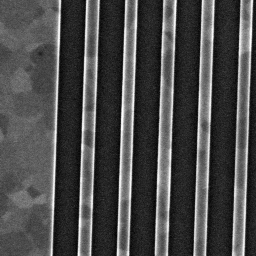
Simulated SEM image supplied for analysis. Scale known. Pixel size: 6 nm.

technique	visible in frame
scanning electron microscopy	parallel lines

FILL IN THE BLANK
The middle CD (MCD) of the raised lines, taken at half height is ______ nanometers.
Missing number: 70.4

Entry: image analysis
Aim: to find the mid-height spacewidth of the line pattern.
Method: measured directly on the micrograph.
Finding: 0.159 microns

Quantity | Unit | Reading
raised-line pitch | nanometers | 230